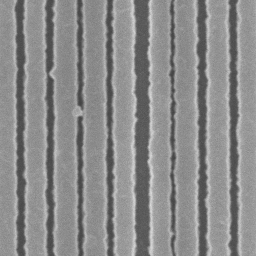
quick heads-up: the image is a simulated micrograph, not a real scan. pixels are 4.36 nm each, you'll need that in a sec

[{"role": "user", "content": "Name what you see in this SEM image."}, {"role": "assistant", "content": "parallel lines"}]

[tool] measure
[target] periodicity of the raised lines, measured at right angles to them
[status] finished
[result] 0.133 microns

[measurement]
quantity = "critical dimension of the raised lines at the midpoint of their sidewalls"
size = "95.4 nanometres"